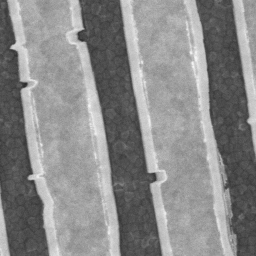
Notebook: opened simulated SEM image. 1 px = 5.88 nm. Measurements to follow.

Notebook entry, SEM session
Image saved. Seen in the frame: one or a few lines or trenches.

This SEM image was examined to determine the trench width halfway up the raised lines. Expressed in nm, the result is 284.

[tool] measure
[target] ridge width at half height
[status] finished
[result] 359 nanometres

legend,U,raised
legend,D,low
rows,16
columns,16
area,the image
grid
DUUUUDDDUUUUDDDU
DUUUUDDDUUUUDDDU
DUUUUDDDUUUUDDDU
DUUUUDDDUUUUUDDU
DDUUUDDDDUUUUDDD
DDUUUUDDDUUUUDDD
DDUUUUDDDUUUUDDD
DDUUUUDDDUUUUDDD
DDUUUUDDDUUUUDDD
DDUUUUDDDUUUUDDD
DDUUUUUDDDUUUDDD
DDDUUUUDDDUUUUDD
DDDUUUUDDDUUUUDD
DDDUUUUDDDUUUUDD
DDDUUUUDDDUUUUDD
DDDUUUUDDDUUUUDD